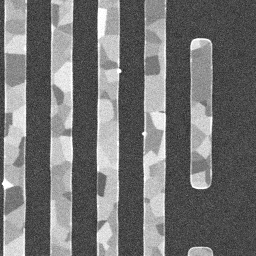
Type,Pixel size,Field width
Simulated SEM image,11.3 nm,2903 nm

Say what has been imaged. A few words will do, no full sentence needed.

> groups of lines, slits or small figures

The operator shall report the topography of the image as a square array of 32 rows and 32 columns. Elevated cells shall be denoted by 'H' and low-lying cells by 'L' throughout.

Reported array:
LHHLLLHHHLLLHHHLLLHHHLLLLLLLLLLL
LHHLLLHHHLLLHHHLLLHHHLLLLLLLLLLL
LHHLLLHHHLLLHHHLLLHHHLLLLLLLLLLL
LHHLLLLHHLLLHHHLLLHHHLLLLLLLLLLL
LHHLLLLHHLLLHHHLLLHHHLLLLLLLLLLL
LHHLLLHHHLLLHHHLLLHHHLLLHHLLLLLL
LHHLLLHHHLLLHHHLLLHHHLLLHHLLLLLL
LHHLLLHHHLLLHHHLLLHHHLLLHHLLLLLL
LHHLLLHHHLLLHHHLLLHHHLLLHHLLLLLL
LHHLLLHHHLLLHHHLLLHHHLLLHHLLLLLL
LHHLLLHHHLLLHHHLLLHHHLLLHHLLLLLL
LHHLLLHHHLLLHHHLLLHHHLLLHHLLLLLL
LHHLLLHHHLLLHHHLLLHHHLLLHHLLLLLL
LHHLLLHHHLLLHHHLLLHHHLLLHHLLLLLL
LHHLLLHHHLLLHHHLLLHHHLLLHHLLLLLL
LHHLLLHHHLLLHHHLLLHHHLLLHHLLLLLL
LHHLLLHHHLLLHHHLLLHHHLLLHHLLLLLL
LHHLLLHHHLLLHHHLLLHHHLLLHHLLLLLL
LHHLLLHHHLLLHHHLLLHHHLLLHHLLLLLL
LHHLLLHHHLLLHHHLLLHHHLLLHHLLLLLL
LHHLLLHHHLLLHHHLLLHHHLLLHHLLLLLL
LHHLLLHHHLLLHHHLLLHHHLLLHHLLLLLL
HHHLLLHHHLLLHHHLLLHHHLLLHHLLLLLL
LHHLLLHHHLLLHHHLLLHHHLLLHHLLLLLL
LHHLLLHHHLLLHHHLLLHHHLLLLLLLLLLL
LHHLLLHHHLLLHHHLLLHHLLLLLLLLLLLL
LHHLLLHHHLLLHHHLLLHHHLLLLLLLLLLL
LHHLLLHHHLLLHHHLLLHHHLLLLLLLLLLL
LHHLLLHHHLLLHHHLLLHHHLLLLLLLLLLL
LHHLLLHHHLLLHHHLLLHHHLLLLLLLLLLL
LHHLLLHHHLLLHHHLLLHHHLLLLLLLLLLL
LHHLLLHHHLLLHHHLLLHHLLLLHHHLLLLL